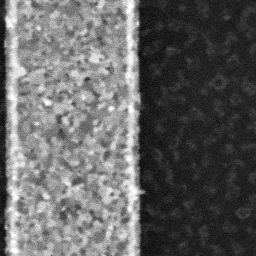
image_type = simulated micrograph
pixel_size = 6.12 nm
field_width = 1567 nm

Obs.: one or a few lines or trenches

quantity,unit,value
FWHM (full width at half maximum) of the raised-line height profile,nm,720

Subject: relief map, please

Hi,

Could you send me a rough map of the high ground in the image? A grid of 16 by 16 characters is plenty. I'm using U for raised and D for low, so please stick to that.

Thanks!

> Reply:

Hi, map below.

DUUUUUUUDDDDDDDD
DUUUUUUUDDDDDDDD
DUUUUUUUDDDDDDDD
DUUUUUUUDDDDDDDD
DUUUUUUUDDDDDDDD
DUUUUUUUDDDDDDDD
DUUUUUUUDDDDDDDD
DUUUUUUUDDDDDDDD
DUUUUUUUDDDDDDDD
DUUUUUUUDDDDDDDD
DUUUUUUUDDDDDDDD
DUUUUUUUDDDDDDDD
DUUUUUUUDDDDDDDD
DUUUUUUUDDDDDDDD
DUUUUUUUDDDDDDDD
DUUUUUUUDDDDDDDD